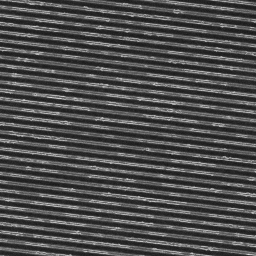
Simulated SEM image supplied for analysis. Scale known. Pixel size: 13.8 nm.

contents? parallel lines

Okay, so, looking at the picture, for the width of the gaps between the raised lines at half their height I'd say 70.1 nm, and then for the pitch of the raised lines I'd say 8.27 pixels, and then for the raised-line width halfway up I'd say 47.9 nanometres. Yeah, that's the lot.